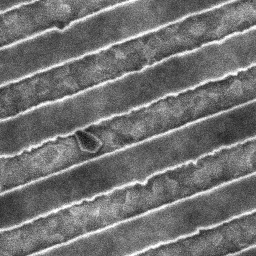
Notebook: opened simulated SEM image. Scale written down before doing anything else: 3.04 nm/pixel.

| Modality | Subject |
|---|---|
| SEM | one or a few lines or trenches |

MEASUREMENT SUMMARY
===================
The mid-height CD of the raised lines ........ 36.1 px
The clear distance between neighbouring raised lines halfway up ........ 97.5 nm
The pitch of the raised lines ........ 207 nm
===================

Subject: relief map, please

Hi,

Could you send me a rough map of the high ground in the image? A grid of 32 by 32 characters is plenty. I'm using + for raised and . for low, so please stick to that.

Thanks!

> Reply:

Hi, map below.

+++............+++++++++++++....
+...........+++++++++++++.......
..........+++++++++++++.........
........++++++++++++...........+
....+++++++++++++............+++
..++++++++++++............++++++
++++++++++++...........+++++++++
+++++++++...........++++++++++++
++++++............+++++++++++++.
++++...........+++++++++++++....
+............++++++++++++.......
..........+++++++++++++.........
.......+++++++++++++............
....+++++++++++++............+++
..++++++++++++............++++++
++++++++++++............++++++++
+++++++++++..........+++++++++++
++++++....++......+++++++++++++.
++++......++...+++++++++++++....
++...........+++++++++++++......
..........+++++++++++++.........
.......+++++++++++++............
.....+++++++++++++...........+++
..+++++++++++++............+++++
++++++++++++............++++++++
+++++++++............+++++++++++
+++++++...........++++++++++++++
++++............+++++++++++++...
++...........+++++++++++++......
..........++++++++++++++........
........++++++++++++............
.....+++++++++++++............++